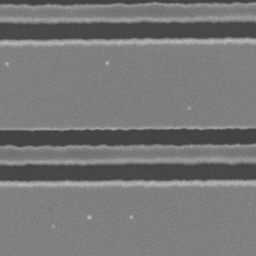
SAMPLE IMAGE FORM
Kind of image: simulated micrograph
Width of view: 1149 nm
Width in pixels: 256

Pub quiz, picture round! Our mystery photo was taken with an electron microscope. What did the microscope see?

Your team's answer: lines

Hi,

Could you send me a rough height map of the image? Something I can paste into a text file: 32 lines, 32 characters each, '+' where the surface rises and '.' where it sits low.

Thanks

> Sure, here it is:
..............++.++++++.++++++++
++++++++++++++++++++++++++++++++
++++++++++++++++++++++++++++++++
................................
................................
++++++++++++++++++++++++++++++++
++++++++++++++++++++++++++++++++
++++++++++++++++++++++++++++++++
++++++++++++++++++++++++++++++++
++++++++++++++++++++++++++++++++
++++++++++++++++++++++++++++++++
++++++++++++++++++++++++++++++++
++++++++++++++++++++++++++++++++
++++++++++++++++++++++++++++++++
++++++++++++++++++++++++++++++++
++++++++++++++++++++++++++++++++
................................
................................
++++++++++++++++++++++++++++++++
++++++++++++++++++++++++++++++++
++++.+++++++....................
................................
................................
++++++++++++++++++++++++++++++++
++++++++++++++++++++++++++++++++
++++++++++++++++++++++++++++++++
++++++++++++++++++++++++++++++++
++++++++++++++++++++++++++++++++
++++++++++++++++++++++++++++++++
++++++++++++++++++++++++++++++++
++++++++++++++++++++++++++++++++
++++++++++++++++++++++++++++++++